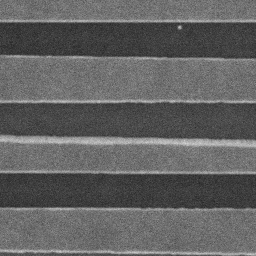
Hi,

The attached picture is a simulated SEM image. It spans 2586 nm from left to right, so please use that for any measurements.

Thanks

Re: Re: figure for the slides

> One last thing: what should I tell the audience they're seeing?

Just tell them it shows lines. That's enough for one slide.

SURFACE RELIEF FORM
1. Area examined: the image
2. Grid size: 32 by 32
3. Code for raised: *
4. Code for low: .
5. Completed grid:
********************************
********************************
********************************
................................
................................
................................
................................
********************************
********************************
********************************
********************************
********************************
********************************
................................
................................
................................
................................
************....................
********************************
********************************
********************************
********************************
................................
................................
................................
................................
********************************
********************************
********************************
********************************
********************************
..*.****************************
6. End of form